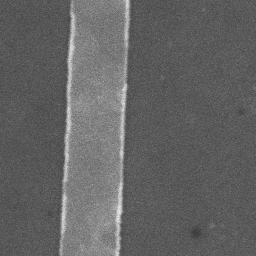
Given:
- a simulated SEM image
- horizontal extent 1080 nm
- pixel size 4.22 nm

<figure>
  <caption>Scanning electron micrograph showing one or a few lines or trenches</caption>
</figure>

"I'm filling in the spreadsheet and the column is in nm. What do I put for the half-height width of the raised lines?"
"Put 244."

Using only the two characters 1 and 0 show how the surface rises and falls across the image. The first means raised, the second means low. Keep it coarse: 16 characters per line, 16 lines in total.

0000111100000000
0000111100000000
0000111100000000
0000111100000000
0000111100000000
0000111100000000
0000111100000000
0000111100000000
0000111100000000
0000111100000000
0000111100000000
0000111100000000
0000111100000000
0000111100000000
0000111000000000
0000111000000000